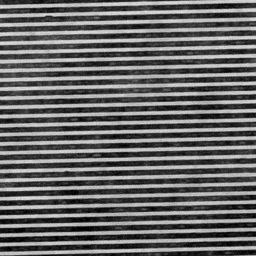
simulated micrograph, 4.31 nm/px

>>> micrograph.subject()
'parallel lines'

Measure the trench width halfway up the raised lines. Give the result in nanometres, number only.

29.1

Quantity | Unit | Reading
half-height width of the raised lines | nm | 11.3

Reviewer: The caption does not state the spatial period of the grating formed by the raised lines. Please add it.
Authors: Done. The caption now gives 39.4 nanometers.